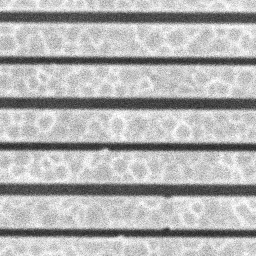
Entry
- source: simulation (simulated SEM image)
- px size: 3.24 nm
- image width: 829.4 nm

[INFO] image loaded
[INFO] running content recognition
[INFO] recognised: parallel lines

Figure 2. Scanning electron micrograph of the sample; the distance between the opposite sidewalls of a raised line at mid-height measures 31.6 pixels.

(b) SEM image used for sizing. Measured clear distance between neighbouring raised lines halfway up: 11.9 px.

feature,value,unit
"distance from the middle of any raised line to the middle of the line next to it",140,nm